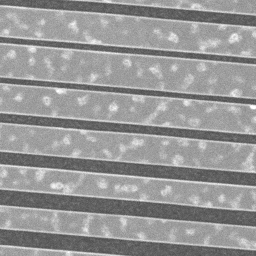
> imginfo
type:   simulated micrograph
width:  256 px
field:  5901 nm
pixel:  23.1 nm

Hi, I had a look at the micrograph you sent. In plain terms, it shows parallel lines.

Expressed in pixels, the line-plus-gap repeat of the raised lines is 39.1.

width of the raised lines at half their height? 678 nm